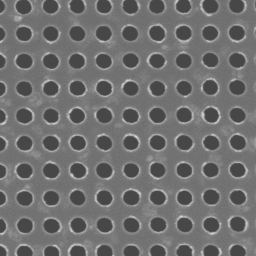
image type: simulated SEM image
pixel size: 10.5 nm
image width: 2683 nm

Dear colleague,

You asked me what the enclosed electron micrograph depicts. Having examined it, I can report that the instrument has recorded a regular array of holes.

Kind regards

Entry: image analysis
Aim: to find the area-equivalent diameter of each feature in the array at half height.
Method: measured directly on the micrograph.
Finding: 15.4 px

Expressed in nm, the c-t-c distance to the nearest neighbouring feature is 278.